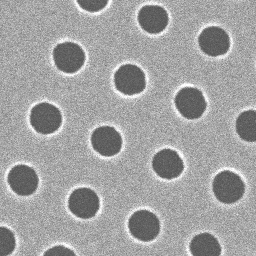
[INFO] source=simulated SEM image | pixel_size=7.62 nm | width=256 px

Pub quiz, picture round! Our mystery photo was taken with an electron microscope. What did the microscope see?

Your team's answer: a regular array of holes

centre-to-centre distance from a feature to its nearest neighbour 0.495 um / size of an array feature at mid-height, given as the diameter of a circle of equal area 243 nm